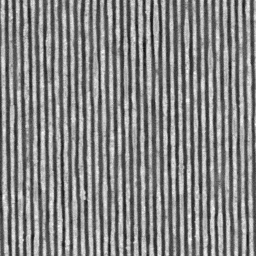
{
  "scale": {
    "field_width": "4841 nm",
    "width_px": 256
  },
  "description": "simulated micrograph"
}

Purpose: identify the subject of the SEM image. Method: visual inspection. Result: parallel lines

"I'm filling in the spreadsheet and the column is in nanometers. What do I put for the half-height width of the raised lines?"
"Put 56.7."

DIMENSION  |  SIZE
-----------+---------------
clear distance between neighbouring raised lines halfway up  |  0.0898 µm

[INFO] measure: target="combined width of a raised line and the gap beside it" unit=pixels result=7.67